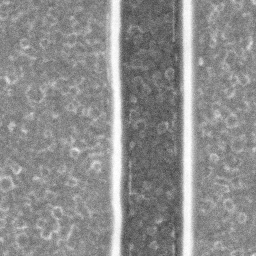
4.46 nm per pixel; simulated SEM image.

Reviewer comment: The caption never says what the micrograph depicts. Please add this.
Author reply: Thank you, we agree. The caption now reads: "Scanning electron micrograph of one or a few lines or trenches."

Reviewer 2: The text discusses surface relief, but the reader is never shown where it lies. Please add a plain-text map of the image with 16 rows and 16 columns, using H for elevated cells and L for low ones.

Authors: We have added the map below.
HHHHHHHLLLLLHHHH
HHHHHHHLLLLLHHHH
HHHHHHHLLLLLHHHH
HHHHHHHLLLLLHHHH
HHHHHHHLLLLLHHHH
HHHHHHHLLLLLHHHH
HHHHHHHLLLLLHHHH
HHHHHHHLLLLLHHHH
HHHHHHHLLLLLHHHH
HHHHHHHLLLLLHHHH
HHHHHHHLLLLLHHHH
HHHHHHHLLLLLHHHH
HHHHHHHLLLLLHHHH
HHHHHHHLLLLLHHHH
HHHHHHHLLLLLHHHH
HHHHHHHLLLLLHHHH